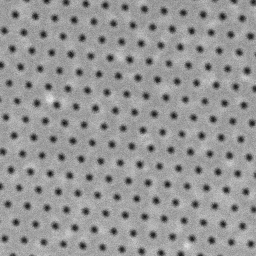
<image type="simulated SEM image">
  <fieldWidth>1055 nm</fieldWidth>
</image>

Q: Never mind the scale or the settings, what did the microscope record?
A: a regular array of holes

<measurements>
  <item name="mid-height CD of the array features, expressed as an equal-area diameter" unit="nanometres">27.1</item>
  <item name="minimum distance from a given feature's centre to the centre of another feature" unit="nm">80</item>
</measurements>